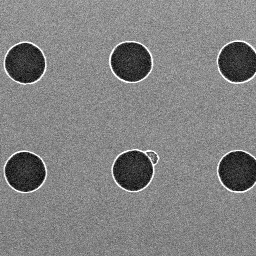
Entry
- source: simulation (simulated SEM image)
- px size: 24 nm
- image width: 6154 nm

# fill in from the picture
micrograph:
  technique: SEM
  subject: holes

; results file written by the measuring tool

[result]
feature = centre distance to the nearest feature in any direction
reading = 2570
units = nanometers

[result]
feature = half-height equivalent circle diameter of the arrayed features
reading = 988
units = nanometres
